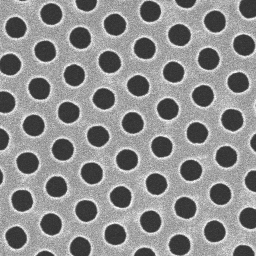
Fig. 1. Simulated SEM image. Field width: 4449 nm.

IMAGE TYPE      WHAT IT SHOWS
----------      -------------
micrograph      a regular array of holes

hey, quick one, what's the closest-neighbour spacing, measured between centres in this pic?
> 648 nanometers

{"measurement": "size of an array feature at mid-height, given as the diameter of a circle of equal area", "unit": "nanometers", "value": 379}